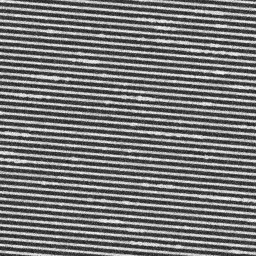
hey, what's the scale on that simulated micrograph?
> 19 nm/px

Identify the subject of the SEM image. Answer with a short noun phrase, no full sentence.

parallel lines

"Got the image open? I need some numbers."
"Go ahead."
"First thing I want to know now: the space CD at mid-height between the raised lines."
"83.1 nm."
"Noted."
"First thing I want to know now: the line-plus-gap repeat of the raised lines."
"0.125 µm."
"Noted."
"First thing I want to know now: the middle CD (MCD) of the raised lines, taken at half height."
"33.2 nm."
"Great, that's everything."